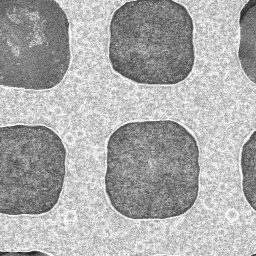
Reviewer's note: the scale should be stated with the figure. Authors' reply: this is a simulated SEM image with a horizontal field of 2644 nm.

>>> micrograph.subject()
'holes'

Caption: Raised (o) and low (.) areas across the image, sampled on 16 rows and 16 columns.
....ooo.....ooo.
....ooo.....ooo.
....ooo.....ooo.
....ooo.....ooo.
....ooo.....ooo.
o..ooooooooooooo
oooooooooooooooo
oooooooooooooooo
....ooo.....oooo
....ooo.....ooo.
....ooo.....ooo.
....ooo.....ooo.
....ooo.....ooo.
oooooooo...ooooo
oooooooooooooooo
oooooooooooooooo